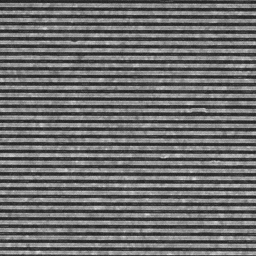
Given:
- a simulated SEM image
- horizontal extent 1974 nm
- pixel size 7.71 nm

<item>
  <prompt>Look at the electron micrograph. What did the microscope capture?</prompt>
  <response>parallel lines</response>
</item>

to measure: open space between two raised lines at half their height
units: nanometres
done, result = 30.8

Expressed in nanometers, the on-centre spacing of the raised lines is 57.8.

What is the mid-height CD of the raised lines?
25 nm